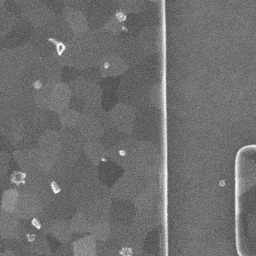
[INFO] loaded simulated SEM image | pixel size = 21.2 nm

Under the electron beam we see wiring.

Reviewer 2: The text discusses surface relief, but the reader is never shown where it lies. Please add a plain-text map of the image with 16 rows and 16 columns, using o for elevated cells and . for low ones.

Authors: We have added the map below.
oooooooooo......
oooooooooo......
oooooooooo......
oooooooooo......
oooooooooo......
oooooooooo......
oooooooooo......
oooooooooo......
oooooooooo......
oooooooooo.....o
oooooooooo.....o
oooooooooo.....o
oooooooooo.....o
oooooooooo.....o
oooooooooo.....o
oooooooooo.....o